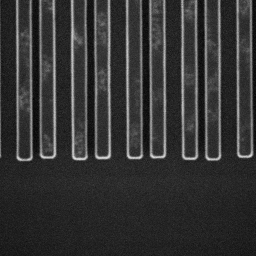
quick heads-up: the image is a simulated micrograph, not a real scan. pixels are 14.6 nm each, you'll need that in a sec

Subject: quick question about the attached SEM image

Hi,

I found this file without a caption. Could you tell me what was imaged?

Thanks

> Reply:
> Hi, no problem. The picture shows parallel lines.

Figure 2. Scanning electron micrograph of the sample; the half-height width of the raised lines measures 14.5 pixels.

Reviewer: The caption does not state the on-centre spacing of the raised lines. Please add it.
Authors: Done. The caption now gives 27.6 px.